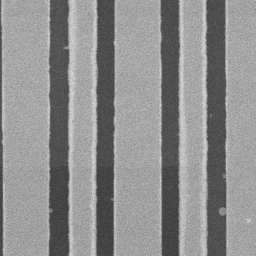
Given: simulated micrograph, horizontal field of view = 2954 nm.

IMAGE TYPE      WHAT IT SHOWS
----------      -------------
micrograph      lines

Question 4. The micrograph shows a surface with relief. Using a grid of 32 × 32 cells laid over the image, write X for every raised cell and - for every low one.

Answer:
XXXXXX---XXX--XXXXXX--XXXX--XXXX
XXXXXX---XXX--XXXXXX---XXX--XXXX
XXXXXX---XXX--XXXXXX--XXXX--XXXX
XXXXXX---XXX--XXXXXX---XXX--XXXX
XXXXXX---XXX--XXXXXX---XXX--XXXX
XXXXXX---XXX--XXXXXX---XXX--XXXX
XXXXXX---XXX--XXXXXX---XXX--XXXX
XXXXXX---XXX--XXXXXX---XXX--XXXX
XXXXXX---XXX--XXXXXX---XXX--XXXX
XXXXXX---XXX--XXXXXX---XXX--XXXX
XXXXXX---XXX--XXXXXX---XXX--XXXX
XXXXXX---XXX--XXXXXX---XXX--XXXX
XXXXXX---XXX--XXXXXX---XXX--XXXX
XXXXXX---XXX--XXXXXX---XXX--XXXX
XXXXXX---XXX--XXXXXX---XXX--XXXX
XXXXXX---XXX--XXXXXX---XXX--XXXX
XXXXXX---XXX--XXXXXX---XXX--XXXX
XXXXXX---XXX--XXXXXX---XXX--XXXX
XXXXXX---XXX--XXXXXX---XXX--XXXX
XXXXXX---XXX--XXXXXX---XXX--XXXX
XXXXXX---XXX--XXXXXX---XXX--XXXX
XXXXXX---XXX--XXXXXX---XXX--XXXX
XXXXXX---XXX--XXXXXX---XXX--XXXX
XXXXXX---XXX--XXXXXX---XXX--XXXX
XXXXXX---XXX--XXXXXX---XXX--XXXX
XXXXXX---XXX--XXXXXX---XXX--XXXX
XXXXXX---XXX--XXXXXX---XXX--XXXX
XXXXXX---XXX--XXXXXX---XXX--XXXX
XXXXXX---XXX--XXXXXX---XXX--XXXX
XXXXXX---XXX--XXXXXX---XXX--XXXX
XXXXXX---XXX--XXXXXX--XXXX--XXXX
XXXXXX---XXX--XXXXXX--XXXX--XXXX